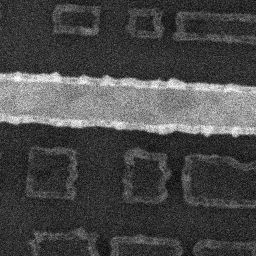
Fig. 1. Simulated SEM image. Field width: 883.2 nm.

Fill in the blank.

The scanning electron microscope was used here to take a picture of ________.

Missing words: one or a few lines or trenches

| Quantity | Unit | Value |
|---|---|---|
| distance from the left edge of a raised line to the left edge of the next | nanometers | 265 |